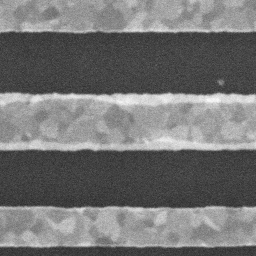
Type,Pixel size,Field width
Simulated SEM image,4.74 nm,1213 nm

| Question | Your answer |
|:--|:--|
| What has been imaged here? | lines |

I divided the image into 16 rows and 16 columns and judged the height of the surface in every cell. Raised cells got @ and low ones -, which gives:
@@@@@@@@@@@@@@@@
@@@@@@@@@@@@@@@@
----------------
----------------
----------------
----------------
@@@@@@@@@@@@@@@@
@@@@@@@@@@@@@@@@
@@@@@@@@@@@@@@@@
----------------
----------------
----------------
----------------
@@@@@@@@@@@@@@@@
@@@@@@@@@@@@@@@@
----------------